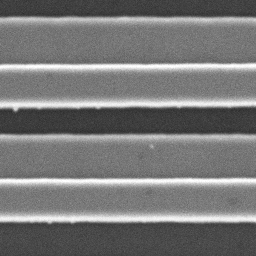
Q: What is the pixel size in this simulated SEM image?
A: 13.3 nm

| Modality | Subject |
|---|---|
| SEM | lines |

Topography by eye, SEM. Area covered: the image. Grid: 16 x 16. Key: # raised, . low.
................
################
################
################
################
################
################
................
#............#..
################
################
################
################
################
................
................